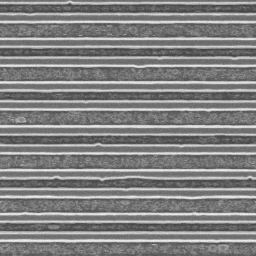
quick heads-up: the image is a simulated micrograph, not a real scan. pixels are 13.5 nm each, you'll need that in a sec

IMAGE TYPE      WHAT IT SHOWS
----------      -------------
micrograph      parallel lines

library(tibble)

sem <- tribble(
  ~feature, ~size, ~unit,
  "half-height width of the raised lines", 113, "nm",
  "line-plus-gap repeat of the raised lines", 21.9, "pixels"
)